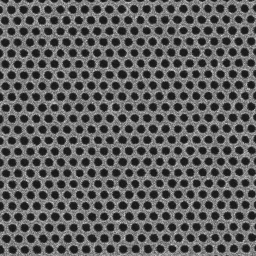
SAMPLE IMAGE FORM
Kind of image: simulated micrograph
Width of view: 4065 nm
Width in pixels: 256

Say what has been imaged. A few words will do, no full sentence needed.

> a regular array of holes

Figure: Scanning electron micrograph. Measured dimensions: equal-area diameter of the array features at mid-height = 0.141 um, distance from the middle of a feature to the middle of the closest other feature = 191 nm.